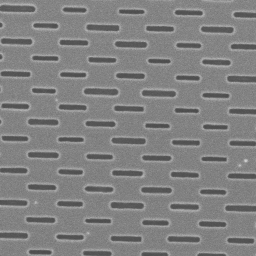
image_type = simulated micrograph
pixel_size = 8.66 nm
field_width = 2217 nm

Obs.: a regular array of holes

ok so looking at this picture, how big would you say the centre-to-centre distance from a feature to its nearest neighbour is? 276 nanometers